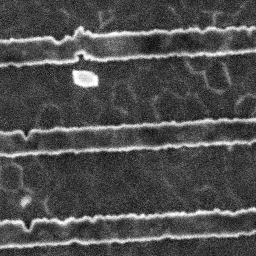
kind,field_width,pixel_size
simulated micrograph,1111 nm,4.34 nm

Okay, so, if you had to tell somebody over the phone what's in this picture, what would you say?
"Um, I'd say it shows one or a few lines or trenches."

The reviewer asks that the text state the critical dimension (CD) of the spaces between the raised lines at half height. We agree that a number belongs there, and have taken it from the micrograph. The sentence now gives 290 nm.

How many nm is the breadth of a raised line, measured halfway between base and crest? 110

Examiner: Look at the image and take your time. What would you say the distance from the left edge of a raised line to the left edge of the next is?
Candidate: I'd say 0.396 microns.